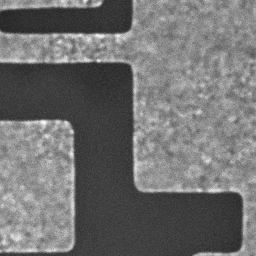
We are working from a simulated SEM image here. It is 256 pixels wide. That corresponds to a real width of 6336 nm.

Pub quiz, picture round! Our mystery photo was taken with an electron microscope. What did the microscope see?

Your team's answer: wiring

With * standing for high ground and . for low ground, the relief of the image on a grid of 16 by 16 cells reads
*.......********
........********
****************
****************
........********
........********
........********
........********
*****...********
*****...********
*****...********
*****....*******
*****..........*
*****..........*
*****..........*
****...........*